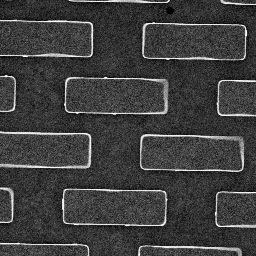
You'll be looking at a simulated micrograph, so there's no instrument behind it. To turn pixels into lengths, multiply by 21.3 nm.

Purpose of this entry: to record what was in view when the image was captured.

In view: groups of lines, slits or small figures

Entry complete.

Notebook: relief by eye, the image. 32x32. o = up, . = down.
..............................oo
................................
................................
ooooooooooo.......ooooooooooooo.
ooooooooooo.......ooooooooooooo.
ooooooooooo.......ooooooooooooo.
ooooooooooo.......ooooooooooooo.
................................
................................
................................
oo......ooooooooooooo......ooooo
oo......ooooooooooooo......ooooo
oo......ooooooooooooo......ooooo
oo......ooooooooooooo......ooooo
................................
................................
................................
ooooooooooo.......oooooooooooo..
ooooooooooo.......oooooooooooo..
ooooooooooo.......oooooooooooo..
ooooooooooo.......oooooooooooo..
................................
................................
................................
oo......ooooooooooooo......ooooo
oo......ooooooooooooo......ooooo
oo......ooooooooooooo......ooooo
o.......ooooooooooooo......ooooo
................................
................................
................................
ooooooooooo......ooooooooooooo..